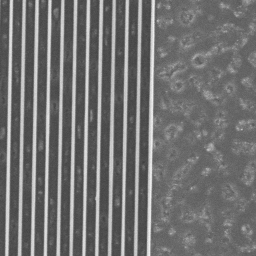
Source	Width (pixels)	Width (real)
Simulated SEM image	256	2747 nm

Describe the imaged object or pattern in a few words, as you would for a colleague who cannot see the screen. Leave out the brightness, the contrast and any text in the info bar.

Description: parallel lines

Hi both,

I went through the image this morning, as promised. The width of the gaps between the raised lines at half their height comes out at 114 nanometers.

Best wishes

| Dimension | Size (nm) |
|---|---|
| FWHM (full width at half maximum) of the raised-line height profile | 30.8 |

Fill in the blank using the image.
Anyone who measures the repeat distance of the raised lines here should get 12.9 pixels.